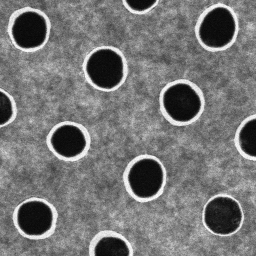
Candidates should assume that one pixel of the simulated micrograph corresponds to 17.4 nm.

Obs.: raised bodies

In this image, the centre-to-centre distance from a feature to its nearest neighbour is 1.44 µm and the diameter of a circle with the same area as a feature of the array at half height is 733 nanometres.